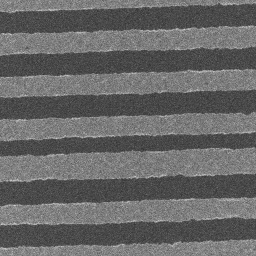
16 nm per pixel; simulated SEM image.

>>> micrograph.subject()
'parallel lines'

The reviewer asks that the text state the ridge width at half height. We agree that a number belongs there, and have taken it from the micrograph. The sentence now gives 316 nanometres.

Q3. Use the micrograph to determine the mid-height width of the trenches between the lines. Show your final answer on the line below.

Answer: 358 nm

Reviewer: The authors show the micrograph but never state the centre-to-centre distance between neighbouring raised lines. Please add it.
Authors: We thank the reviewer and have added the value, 682 nanometers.